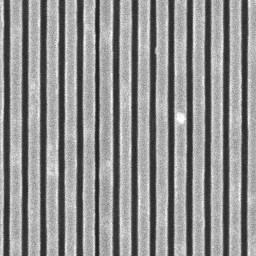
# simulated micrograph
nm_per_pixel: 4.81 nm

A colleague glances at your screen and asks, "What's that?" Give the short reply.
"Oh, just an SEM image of parallel lines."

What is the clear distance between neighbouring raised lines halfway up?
26.4 nm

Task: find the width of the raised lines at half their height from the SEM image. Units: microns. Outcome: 0.0613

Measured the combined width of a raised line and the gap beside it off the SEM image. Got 18.3 px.